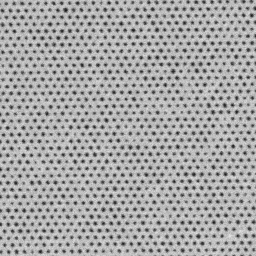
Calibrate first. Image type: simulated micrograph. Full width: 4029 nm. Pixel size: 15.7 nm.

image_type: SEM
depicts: a regular array of holes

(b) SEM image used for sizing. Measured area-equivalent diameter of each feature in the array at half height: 0.064 um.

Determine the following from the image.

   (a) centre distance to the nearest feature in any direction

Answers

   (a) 0.122 µm